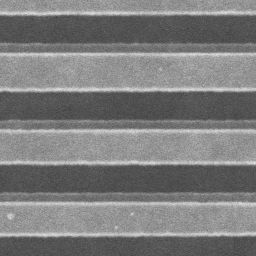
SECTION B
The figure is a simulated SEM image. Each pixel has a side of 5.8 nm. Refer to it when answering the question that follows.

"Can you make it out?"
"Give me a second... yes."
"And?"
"lines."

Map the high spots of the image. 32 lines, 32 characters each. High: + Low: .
++++++++++++++++++++++++++++++++
++++++++++++++++++++++++++++++++
................................
................................
................................
++..+.........+.+...............
++++++++++++++++++++++++++++++++
++++++++++++++++++++++++++++++++
++++++++++++++++++++++++++++++++
++++++++++++++++++++++++++++++++
++++++++++++++++++++++++++++++++
................................
................................
................................
................................
++++++++++++++++++++++++++++++++
++++++++++++++++++++++++++++++++
++++++++++++++++++++++++++++++++
++++++++++++++++++++++++++++++++
++++++++++++++++++++++++++++++++
++++++++++++++++++++++++++++++++
................................
................................
................................
++++++++++++++++++++++++++++++++
++++++++++++++++++++++++++++++++
++++++++++++++++++++++++++++++++
++++++++++++++++++++++++++++++++
++++++++++++++++++++++++++++++++
..+..+++.+.......+..............
................................
................................